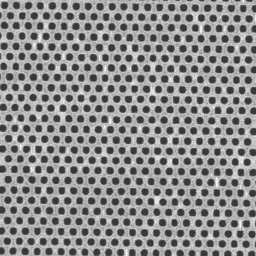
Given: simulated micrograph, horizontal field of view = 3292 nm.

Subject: a regular array of holes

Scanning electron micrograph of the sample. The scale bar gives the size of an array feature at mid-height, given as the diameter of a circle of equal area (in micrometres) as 0.103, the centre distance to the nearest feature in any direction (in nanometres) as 148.